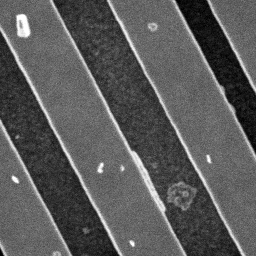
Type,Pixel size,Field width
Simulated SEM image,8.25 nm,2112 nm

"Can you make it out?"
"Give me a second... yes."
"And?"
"lines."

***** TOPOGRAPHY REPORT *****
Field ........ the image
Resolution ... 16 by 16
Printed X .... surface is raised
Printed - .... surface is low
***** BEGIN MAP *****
XXXX---XXXX--XXX
XXXX---XXXXX--XX
XXXXX---XXXX--XX
-XXXX---XXXXX--X
-XXXXX---XXXX--X
--XXXX----XXXX--
--XXXXX---XXXX--
---XXXX----XXXX-
X---XXXX---XXXX-
X---XXXX----XXXX
XX---XXXX---XXXX
XX---XXXX----XXX
XXX---XXXX---XXX
XXX---XXXX----XX
XXXX---XXXX---XX
XXXX---XXXX----X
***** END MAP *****